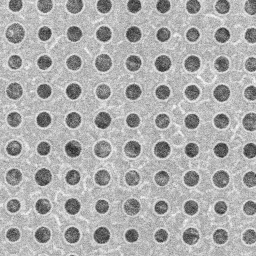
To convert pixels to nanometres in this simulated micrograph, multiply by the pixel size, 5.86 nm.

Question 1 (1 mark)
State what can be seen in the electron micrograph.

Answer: a regular array of holes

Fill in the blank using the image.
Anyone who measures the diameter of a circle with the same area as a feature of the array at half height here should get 0.0991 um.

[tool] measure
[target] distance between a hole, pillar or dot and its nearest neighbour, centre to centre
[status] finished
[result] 168 nm